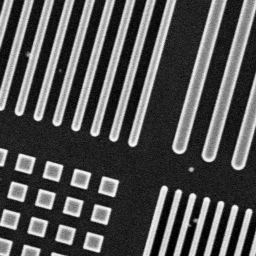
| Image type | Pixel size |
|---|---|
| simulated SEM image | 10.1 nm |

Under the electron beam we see groups of lines, slits or small figures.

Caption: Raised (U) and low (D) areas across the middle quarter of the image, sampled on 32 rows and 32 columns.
DUUDDDUUDDDUUDDDUUDDDUUDDDDDDDDD
DUUDDDUUDDDUUDDDUUDDDUUDDDDDDDDD
DUUDDDUUDDDUUDDDUUDDDUUDDDDDDDDD
UUDDDUUDDDUUDDDDUUDDDUUDDDDDDDDD
UUDDDUUDDDUUDDDUUDDDUUDDDDDDDDDD
UUDDDUUDDDUUDDDUUDDDUUDDDDDDDDDU
UDDDDUUDDDUUDDDUUDDDUUDDDDDDDDDU
UDDDUUDDDUUDDDUUDDDDUUDDDDDDDDDU
UDDDUUDDDUUDDDUUDDDUUDDDDDDDDDDU
UDDDUUDDDUUDDDUUDDDUUDDDDDDDDDUU
DDDUUDDDDUUDDDUUDDDUUDDDDDDDDDUU
DDDUUDDDUUDDDUUDDDUUDDDDDDDDDDUU
DDDUUDDDUUDDDUUDDDUUDDDDDDDDDUUU
DDDUUDDDUUDDDUUDDDUUDDDDDDDDDUUU
DDUUDDDUUDDDDUUDDDUUDDDDDDDDDUUU
DDUUDDDUUDDDUUDDDUUDDDDDDDDDDUUU
DDUUDDDUUDDDUUDDDUUDDDDDDDDDUUUU
DDDDDDDUUDDDUUDDDUUDDDDDDDDDUUUD
DDDDDDDDDDDDUDDDUUUDDDDDDDDDUUUD
DDDDDDDDDDDDDDDDUUDDDDDDDDDDUUUD
DDDDDDDDDDDDDDDDDUDDDDDDDDDUUUUD
DDDDDDDDDDDDDDDDDDDDDDDDDDDUUUDD
DDDDDDDDDDDDDDDDDDDDDDDDDDDDDDDD
DDDDDDDDDDDDDDDDDDDDDDDDDDDDDDDD
DDDDDDDDDDDDDDDDDDDDDDDDDDDDDDDD
DDDDDDDDDDDDDDDDDDDDDDDDDDDDDDDD
DDDDDDDDDDDDDDDDDDDDDDDDDDDDDDDD
DDDUUUDDDDDDDDDDDDDDDDDDDDDDDDDD
DDUUUUDDDDDDDDDDDDDDDDDDDDDDDDDD
DDUUUUDDDUUUUDDDDDDDDDDDDDDDDDDD
DDDUUUDDDUUUUDDDDDDDDDDDDDDDDDDD
DDDDDDDDDUUUUDDDDDDDDDDDUUDDDDDD